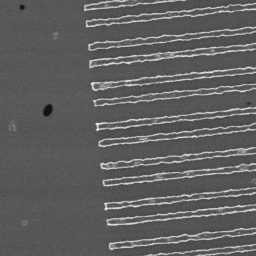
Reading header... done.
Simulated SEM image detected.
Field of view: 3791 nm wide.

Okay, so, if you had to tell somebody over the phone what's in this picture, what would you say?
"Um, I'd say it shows parallel lines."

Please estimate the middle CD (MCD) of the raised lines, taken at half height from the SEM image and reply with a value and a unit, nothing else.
0.0828 micrometres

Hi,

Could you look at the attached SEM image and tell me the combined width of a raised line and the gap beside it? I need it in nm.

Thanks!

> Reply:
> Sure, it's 296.